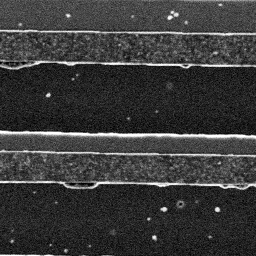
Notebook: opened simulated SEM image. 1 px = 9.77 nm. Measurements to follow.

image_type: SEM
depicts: lines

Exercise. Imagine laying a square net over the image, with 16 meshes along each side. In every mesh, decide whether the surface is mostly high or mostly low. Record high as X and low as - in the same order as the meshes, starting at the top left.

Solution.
XXXXXXXXXXXXXXXX
XXXXXXXXXXXXXXXX
XXXXXXXXXXXXXXXX
XXXXXXXXXXXXXXXX
----------------
----------------
----------------
----------------
XXXXXXXXXXXXX-XX
XXXXXXXXXXXXXXXX
XXXXXXXXXXXXXXXX
----XX---XXXXXXX
----------------
----------------
----------------
----------------